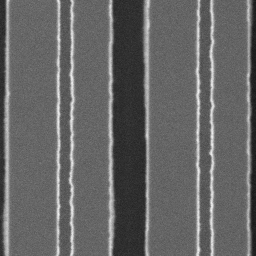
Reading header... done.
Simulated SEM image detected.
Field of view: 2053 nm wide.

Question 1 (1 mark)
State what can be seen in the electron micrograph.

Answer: lines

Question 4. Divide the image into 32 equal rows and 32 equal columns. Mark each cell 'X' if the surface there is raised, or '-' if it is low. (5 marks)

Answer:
-XXXXXXXXXXXXX----XXXXXXXXXXXXX-
-XXXXXXXXXXXXX----XXXXXXXXXXXXX-
-XXXXXXXXXXXXX----XXXXXXXXXXXXX-
-XXXXXXXXXXXXX----XXXXXXXXXXXXX-
-XXXXXXXXXXXXX----XXXXXXXXXXXXX-
-XXXXXXXXXXXXX----XXXXXXXXXXXXX-
-XXXXXXXXXXXXX----XXXXXXXXXXXXX-
-XXXXXXXXXXXXX----XXXXXXXXXXXXX-
-XXXXXXXXXXXXX----XXXXXXXXXXXXX-
-XXXXXXXXXXXXX----XXXXXXXXXXXXX-
-XXXXXXXXXXXXX----XXXXXXXXXXXXX-
-XXXXXXXXXXXXX----XXXXXXXXXXXXX-
-XXXXXXXXXXXXX----XXXXXXXXXXXXX-
-XXXXXXXXXXXXX----XXXXXXXXXXXXX-
-XXXXXXXXXXXXX----XXXXXXXXXXXXX-
-XXXXXXXXXXXXX----XXXXXXXXXXXXX-
-XXXXXXXXXXXXX----XXXXXXXXXXXXX-
-XXXXXXXXXXXXX----XXXXXXXXXXXXX-
-XXXXXXXXXXXXX----XXXXXXXXXXXXX-
-XXXXXXXXXXXXX----XXXXXXXXXXXXX-
-XXXXXXXXXXXXX----XXXXXXXXXXXXX-
-XXXXXXXXXXXXX----XXXXXXXXXXXXX-
-XXXXXXXXXXXXX----XXXXXXXXXXXXX-
-XXXXXXXXXXXXX----XXXXXXXXXXXXX-
-XXXXXXXXXXXXX----XXXXXXXXXXXXX-
-XXXXXXXXXXXXX----XXXXXXXXXXXXX-
-XXXXXXXXXXXXX----XXXXXXXXXXXXX-
-XXXXXXXXXXXXX----XXXXXXXXXXXXX-
-XXXXXXXXXXXXX----XXXXXXXXXXXXX-
-XXXXXXXXXXXXX----XXXXXXXXXXXXX-
-XXXXXXXXXXXXX----XXXXXXXXXXXXX-
-XXXXXXXXXXXXX----XXXXXXXXXXXXX-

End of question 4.